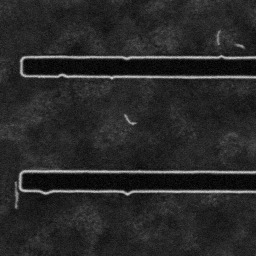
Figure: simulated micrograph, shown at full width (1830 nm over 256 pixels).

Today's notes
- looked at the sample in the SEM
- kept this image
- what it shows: one or a few lines or trenches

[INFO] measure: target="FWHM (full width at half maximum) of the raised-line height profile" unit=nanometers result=141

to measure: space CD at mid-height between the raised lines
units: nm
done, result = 680